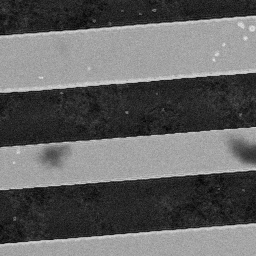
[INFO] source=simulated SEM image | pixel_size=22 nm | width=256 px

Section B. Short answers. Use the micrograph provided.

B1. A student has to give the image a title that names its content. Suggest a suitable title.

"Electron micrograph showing lines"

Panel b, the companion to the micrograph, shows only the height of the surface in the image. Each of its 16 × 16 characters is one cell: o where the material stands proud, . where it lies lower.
................
..........oooooo
oooooooooooooooo
oooooooooooooooo
oooooooooooooooo
oooo............
................
................
.........ooooooo
oooooooooooooooo
oooooooooooooooo
ooooo...........
................
................
.........ooooooo
oooooooooooooooo